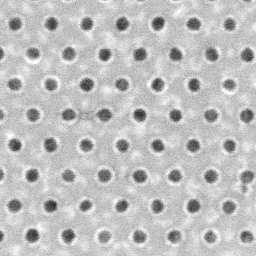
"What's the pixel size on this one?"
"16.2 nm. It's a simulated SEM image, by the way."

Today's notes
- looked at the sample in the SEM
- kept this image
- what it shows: a regular array of raised bodies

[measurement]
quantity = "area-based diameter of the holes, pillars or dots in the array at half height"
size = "16.9 pixels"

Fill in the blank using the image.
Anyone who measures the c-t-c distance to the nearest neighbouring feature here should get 566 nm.